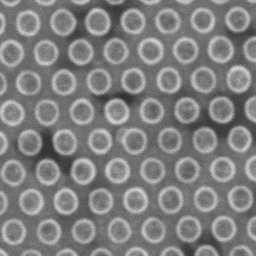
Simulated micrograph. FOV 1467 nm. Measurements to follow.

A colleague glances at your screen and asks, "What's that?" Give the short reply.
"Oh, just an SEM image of a regular array of raised bodies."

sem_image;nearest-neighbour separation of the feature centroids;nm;196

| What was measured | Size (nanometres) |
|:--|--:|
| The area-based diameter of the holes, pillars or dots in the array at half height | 128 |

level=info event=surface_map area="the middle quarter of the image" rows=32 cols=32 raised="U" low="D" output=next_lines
DDDDDDDDDDDDDDDDDDDDDDDDDDDDDDDD
DDDDDDDDDDDDDDDDDUDDDDDDDUUDDDDD
UDDDDDDUUUUDDDDUUUUDDDDDUUUUDDDD
UUDDDDUUUUUDDDDUUUUUDDDDUUUUUDDD
UUDDDDUUUUUDDDDUUUUUDDDDUUUUUDDD
UUDDDDUUUUUDDDDUUUUUDDDDUUUUDDDD
UUDDDDDUUUDDDDDDUUUDDDDDDUUUDDDD
DDDDDDDDDDDDDDDDDDDDDDDDDDDDDDDD
DDDDDDDDDDDDDDDDDDDDDDDDDDDDDDDD
DDDUUDDDDDDDUUUDDDDDUUUDDDDDDUUU
DDUUUUUDDDDUUUUDDDDDUUUUDDDDUUUU
DDUUUUUDDDDUUUUUDDDUUUUUDDDDUUUU
DDUUUUUDDDDUUUUUDDDUUUUUDDDDUUUU
DDUUUUUDDDDUUUUDDDDDUUUUDDDDDUUU
DDDUUUDDDDDDUUDDDDDDDDUDDDDDDDDD
DDDDDDDDDDDDDDDDDDDDDDDDDDDDDDDD
DDDDDDDDDDDDDDDDDUDDDDDDDDDDDDDD
UUDDDDDUUUUDDDDUUUUUDDDDUUUUUDDD
UUDDDDDUUUUDDDDUUUUUDDDDUUUUUDDD
UUUDDDUUUUUDDDDUUUUUDDDDUUUUUDDD
UUUDDDDUUUUDDDDUUUUUDDDDUUUUUDDD
UUDDDDDDUUDDDDDDUUUDDDDDDUUUDDDD
DDDDDDDDDDDDDDDDDDDDDDDDDDDDDDDD
DDDDDDDDDDDDDDDDDDDDDDDDDDDDDDDD
DDDUUUDDDDDDUUUDDDDDUUUUDDDDDUUU
DDDUUUUDDDDUUUUUDDDDUUUUUDDDUUUU
DDUUUUUDDDDUUUUUDDDUUUUUUDDDUUUU
DDUUUUUDDDDUUUUUDDDUUUUUUDDDUUUU
DDDUUUUDDDDUUUUDDDDDUUUUDDDDDUUU
DDDDUDDDDDDDDDDDDDDDDDDDDDDDDDDD
DDDDDDDDDDDDDDDDDDDDDDDDDDDDDDDD
DDDDDDDDDUDDDDDDDUUDDDDDDUUUDDDD